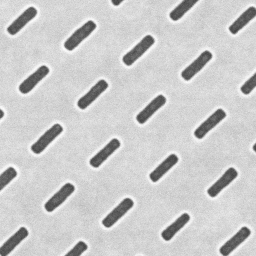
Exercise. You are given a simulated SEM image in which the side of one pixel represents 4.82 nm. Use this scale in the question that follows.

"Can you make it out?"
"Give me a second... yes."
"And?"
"a regular array of holes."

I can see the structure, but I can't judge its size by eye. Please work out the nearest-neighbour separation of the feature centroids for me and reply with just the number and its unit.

289 nm